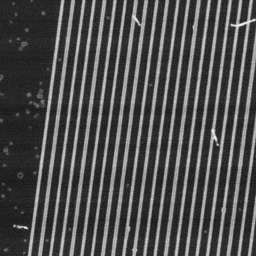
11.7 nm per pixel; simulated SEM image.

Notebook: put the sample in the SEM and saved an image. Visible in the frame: parallel lines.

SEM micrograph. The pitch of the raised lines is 121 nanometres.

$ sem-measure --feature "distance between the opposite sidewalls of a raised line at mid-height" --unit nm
30.4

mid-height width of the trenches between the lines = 0.0881 micrometres